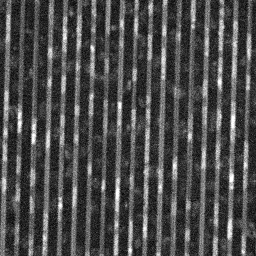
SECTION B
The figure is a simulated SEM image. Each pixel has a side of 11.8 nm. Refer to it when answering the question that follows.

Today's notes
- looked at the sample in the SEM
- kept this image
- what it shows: parallel lines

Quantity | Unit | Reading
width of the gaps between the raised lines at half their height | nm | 132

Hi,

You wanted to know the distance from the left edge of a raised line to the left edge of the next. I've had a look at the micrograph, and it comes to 168 nm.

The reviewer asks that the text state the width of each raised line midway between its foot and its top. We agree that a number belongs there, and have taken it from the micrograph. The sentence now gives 39.9 nm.